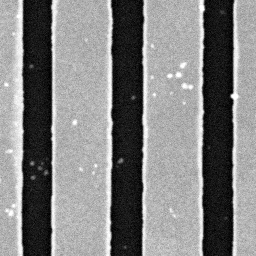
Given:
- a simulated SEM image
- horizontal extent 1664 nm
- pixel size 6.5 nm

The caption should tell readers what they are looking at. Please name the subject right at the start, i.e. lines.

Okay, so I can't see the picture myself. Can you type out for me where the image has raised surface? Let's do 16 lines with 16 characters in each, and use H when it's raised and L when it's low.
HLLHHHHLLHHHHLLH
HLLHHHHLLHHHHLLH
HLLHHHHLLHHHHLLH
HLLHHHHLLHHHHLLH
HLLHHHHLLHHHHLLH
HLLHHHHLLHHHHLLH
HLLHHHHLLHHHHLLH
HLLHHHHLLHHHHLLH
HLLHHHHLLHHHHLLH
HLLHHHHLLHHHHLLH
HLLHHHHLLHHHHLLH
HLLHHHHLLHHHHLLH
HLLHHHHLLHHHHLLH
HLLHHHHLLHHHHLLH
HLLHHHHLLHHHHLLH
HLLHHHHLLHHHHLLH